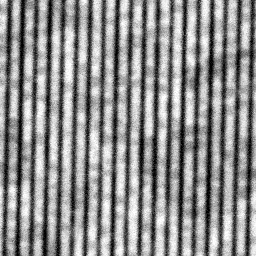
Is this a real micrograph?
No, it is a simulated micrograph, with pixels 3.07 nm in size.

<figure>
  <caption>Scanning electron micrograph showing parallel lines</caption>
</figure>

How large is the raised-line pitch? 41.5 nm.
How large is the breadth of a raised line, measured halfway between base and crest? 8.73 pixels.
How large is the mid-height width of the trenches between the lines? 13.4 nanometers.